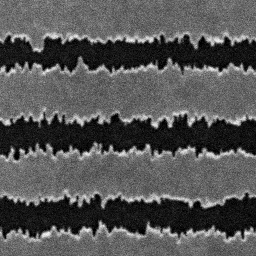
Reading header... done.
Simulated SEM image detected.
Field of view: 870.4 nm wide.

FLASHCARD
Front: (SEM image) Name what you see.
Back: one or a few lines or trenches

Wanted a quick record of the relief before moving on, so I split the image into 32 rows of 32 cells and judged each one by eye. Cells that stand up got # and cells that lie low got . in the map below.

################################
################################
################################
################################
################################
....#...................#.......
................................
................................
..###.....#.......#..#.#....##..
################################
################################
################################
################################
################################
##############.#######.#########
...................#............
................................
................................
...........#......#.............
.###############################
################################
################################
################################
################################
##############################.#
.........................###....
................................
................................
............#...................
####.#######################.#.#
################################
################################